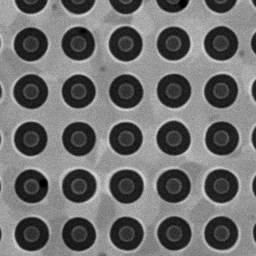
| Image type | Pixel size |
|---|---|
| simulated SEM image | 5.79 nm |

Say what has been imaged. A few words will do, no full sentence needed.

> an array of small figures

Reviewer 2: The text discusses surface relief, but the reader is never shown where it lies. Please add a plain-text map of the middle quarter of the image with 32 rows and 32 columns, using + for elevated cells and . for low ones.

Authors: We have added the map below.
++++++++++++++++++++++++++++++++
++++++++++++++++++++++++++++++++
+++..++++++++++.++++++++++...+++
+.....+++++++.....++++++......++
.......+++++.......+++++.......+
...++...+++...+++...+++...+++...
..+++...+++...+++...+++...+++...
..+++...+++...+++...+++...+++...
........+++....+....+++....+...+
.......+++++.......+++++.......+
+.....+++++++.....+++++++.....++
++++++++++++++++++++++++++++++++
++++++++++++++++++++++++++++++++
++++++++++++++++++++++++++++++++
+++..+++++++++...+++++++++...+++
+......+++++.......+++++......++
.......++++........+++++.......+
...++...+++...+++...+++...+++...
..+++...+++...+++...+++...+++...
..+++...+++...+++...+++...+++...
........+++........++++.........
+......+++++.......+++++.......+
++....+++++++....++++++++.....++
++++++++++++++++++++++++++++++++
++++++++++++++++++++++++++++++++
++++++++++++++++++++++++++++++++
++....+++++++.....+++++++.....++
.......+++++.......+++++.......+
........+++.........+++........+
...++....++...+++...+++...+++...
..++++...++...+++...+++...+++...
..+++...+++...+++...+++...+++...